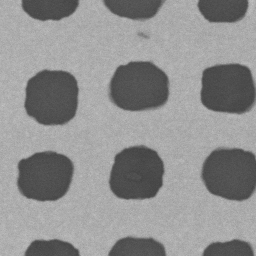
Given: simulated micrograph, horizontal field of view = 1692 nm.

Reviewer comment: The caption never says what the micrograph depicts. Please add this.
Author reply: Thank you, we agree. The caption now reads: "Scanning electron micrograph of holes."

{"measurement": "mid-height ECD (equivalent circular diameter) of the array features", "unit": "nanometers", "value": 365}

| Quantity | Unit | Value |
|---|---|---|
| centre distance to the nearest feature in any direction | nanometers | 549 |